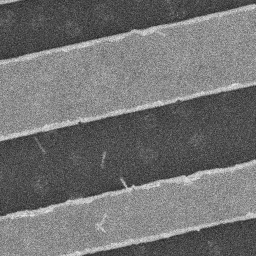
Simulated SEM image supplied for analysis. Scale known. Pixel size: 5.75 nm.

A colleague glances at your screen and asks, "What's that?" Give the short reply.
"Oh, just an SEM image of one or a few lines or trenches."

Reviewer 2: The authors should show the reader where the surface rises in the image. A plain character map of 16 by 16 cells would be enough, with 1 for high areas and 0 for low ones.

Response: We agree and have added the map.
0000000000000001
0000000000011111
0000001111111111
0011111111111111
1111111111111111
1111111111111110
1111111111000000
1111100000000000
1000000000000000
0000000000000000
0000000000000011
0000000001111111
0000011111111111
0111111111111111
1111111111100000
1111111000000000